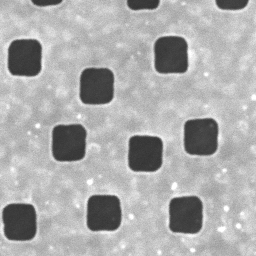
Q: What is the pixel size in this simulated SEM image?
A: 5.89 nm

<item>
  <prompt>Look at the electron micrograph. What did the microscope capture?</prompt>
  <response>a regular array of holes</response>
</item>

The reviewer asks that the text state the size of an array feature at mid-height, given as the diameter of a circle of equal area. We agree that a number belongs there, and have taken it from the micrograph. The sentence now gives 231 nm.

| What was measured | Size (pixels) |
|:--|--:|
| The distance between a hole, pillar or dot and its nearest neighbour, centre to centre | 73.1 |